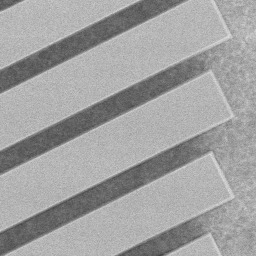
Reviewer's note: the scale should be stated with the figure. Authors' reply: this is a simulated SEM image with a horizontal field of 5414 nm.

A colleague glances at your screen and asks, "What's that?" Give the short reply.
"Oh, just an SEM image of one or a few lines or trenches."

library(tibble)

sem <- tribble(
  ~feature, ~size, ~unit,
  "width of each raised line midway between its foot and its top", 1090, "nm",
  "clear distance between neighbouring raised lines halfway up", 460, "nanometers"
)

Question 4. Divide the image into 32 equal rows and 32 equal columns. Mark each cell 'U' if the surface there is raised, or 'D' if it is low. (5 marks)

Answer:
DDUUUUUUUUUUUUUUUDDDDDDUUUUDDDDD
UUUUUUUUUUUUUUUDDDDDDUUUUUUDDDDD
UUUUUUUUUUUUUDDDDDDUUUUUUUUUDDDD
UUUUUUUUUUUDDDDDDUUUUUUUUUUUDDDD
UUUUUUUUUDDDDDDUUUUUUUUUUUUUUDDD
UUUUUUUDDDDDUUUUUUUUUUUUUUUDDDDD
UUUUUDDDDDUUUUUUUUUUUUUUUDDDDDDD
UUDDDDDDUUUUUUUUUUUUUUUDDDDDDDDD
DDDDDDUUUUUUUUUUUUUUUDDDDDDDDDDD
DDDDUUUUUUUUUUUUUUUDDDDDDUUDDDDD
DDUUUUUUUUUUUUUUUDDDDDDUUUUDDDDD
UUUUUUUUUUUUUUUDDDDDDUUUUUUUDDDD
UUUUUUUUUUUUUDDDDDDUUUUUUUUUDDDD
UUUUUUUUUUUDDDDDDUUUUUUUUUUUUDDD
UUUUUUUUUDDDDDDUUUUUUUUUUUUUUDDD
UUUUUUUDDDDDDUUUUUUUUUUUUUUDDDDD
UUUUUDDDDDDUUUUUUUUUUUUUUDDDDDDD
UUUDDDDDDUUUUUUUUUUUUUUDDDDDDDDD
UDDDDDDUUUUUUUUUUUUUUDDDDDDDDDDD
DDDDDUUUUUUUUUUUUUUDDDDDDUUDDDDD
DDDUUUUUUUUUUUUUUDDDDDDUUUUDDDDD
DUUUUUUUUUUUUUUDDDDDDUUUUUUUDDDD
UUUUUUUUUUUUUDDDDDDUUUUUUUUUDDDD
UUUUUUUUUUUDDDDDDUUUUUUUUUUUUDDD
UUUUUUUUUDDDDDDUUUUUUUUUUUUUUDDD
UUUUUUUDDDDDDUUUUUUUUUUUUUUUDDDD
UUUUUDDDDDDUUUUUUUUUUUUUUUDDDDDD
UUUDDDDDDUUUUUUUUUUUUUUDDDDDDDDD
UDDDDDDUUUUUUUUUUUUUUDDDDDDDDDDD
DDDDDUUUUUUUUUUUUUUDDDDDDDDDDDDD
DDDUUUUUUUUUUUUUUDDDDDDDUUUDDDDD
DUUUUUUUUUUUUUUDDDDDDDUUUUUDDDDD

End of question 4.